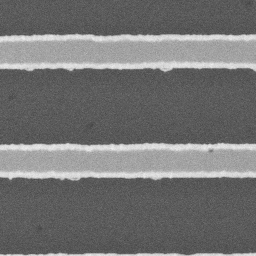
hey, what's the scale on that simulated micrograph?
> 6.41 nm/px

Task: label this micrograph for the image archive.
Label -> lines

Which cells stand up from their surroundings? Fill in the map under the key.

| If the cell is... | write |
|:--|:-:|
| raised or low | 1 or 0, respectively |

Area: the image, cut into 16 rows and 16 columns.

0000000000000000
0000000000000000
1111111111111111
1111111111111111
0000000000000000
0000000000000000
0000000000000000
0000000000000000
0000000000000000
1111111111111111
1111111111111111
0000000000000000
0000000000000000
0000000000000000
0000000000000000
0000000000000000